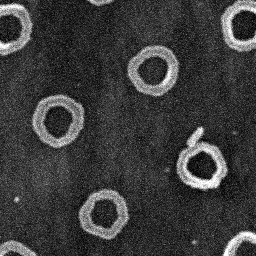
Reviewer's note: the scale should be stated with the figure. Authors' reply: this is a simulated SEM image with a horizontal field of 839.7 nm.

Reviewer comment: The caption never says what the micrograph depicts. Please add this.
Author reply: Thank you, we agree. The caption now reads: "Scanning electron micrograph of ring-shaped raised bodies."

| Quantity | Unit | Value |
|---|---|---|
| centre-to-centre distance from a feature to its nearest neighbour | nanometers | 342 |